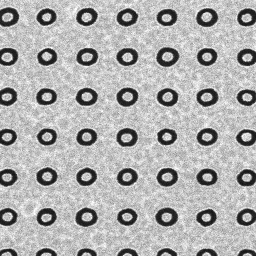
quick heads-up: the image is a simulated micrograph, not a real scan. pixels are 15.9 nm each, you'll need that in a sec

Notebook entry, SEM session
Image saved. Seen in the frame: a regular array of ring-shaped grooves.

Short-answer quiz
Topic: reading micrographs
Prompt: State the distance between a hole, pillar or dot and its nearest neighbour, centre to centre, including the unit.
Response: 630 nanometres